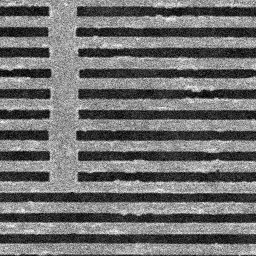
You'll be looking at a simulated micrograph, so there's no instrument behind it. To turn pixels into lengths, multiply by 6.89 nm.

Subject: parallel lines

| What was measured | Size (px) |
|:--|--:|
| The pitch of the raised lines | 20.7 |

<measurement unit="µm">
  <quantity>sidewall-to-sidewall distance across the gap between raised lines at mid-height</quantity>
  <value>0.0724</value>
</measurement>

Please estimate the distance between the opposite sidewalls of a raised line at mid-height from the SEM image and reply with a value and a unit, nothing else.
73.3 nm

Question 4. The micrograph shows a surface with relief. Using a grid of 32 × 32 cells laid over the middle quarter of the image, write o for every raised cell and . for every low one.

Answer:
oooooooooooooooooooooooooooooooo
oooo............................
oooo............................
oooo.......................ooo..
oooooooooooooooooooooooooooooooo
oooooooooooooooooooooooooooooooo
oooo............................
ooo.............................
oooo............................
oooooooooooooooooooooooooooooooo
oooooooooooooooooooooooooooooooo
oooo............................
oooo............................
oooo............................
oooooooooooooooooooooooooooooooo
oooooooooooooooooooooooooooooooo
ooo.oo......o...................
ooo.............................
ooo.............................
oooooooooooooooooooooooooooooooo
oooooooooooooooooooooooooooooooo
oooo....oooooooooooooooooooooooo
ooo.............................
ooo.............................
oooooooooooooooooooooooooooooooo
oooooooooooooooooooooooooooooooo
oooooooooooooooooooooooooooooooo
ooo.............................
ooo.............................
oooo........oooooooo............
oooooooooooooooooooooooooooooooo
oooooooooooooooooooooooooooooooo